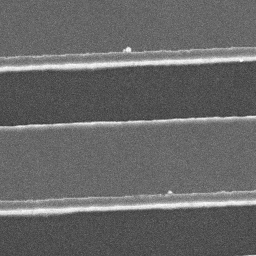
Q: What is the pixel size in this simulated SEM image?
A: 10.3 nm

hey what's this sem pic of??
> lines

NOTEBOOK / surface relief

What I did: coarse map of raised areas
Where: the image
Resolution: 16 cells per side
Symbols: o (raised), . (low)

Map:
oooooooooooooooo
oooooooooooooooo
oooooooooooooooo
oooooooooooooooo
................
................
................
...........ooooo
oooooooooooooooo
oooooooooooooooo
oooooooooooooooo
oooooooooooooooo
oooooooooooooooo
................
................
................